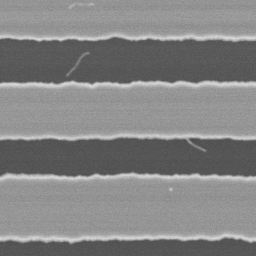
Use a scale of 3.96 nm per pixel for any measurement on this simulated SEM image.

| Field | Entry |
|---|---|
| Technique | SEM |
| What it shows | lines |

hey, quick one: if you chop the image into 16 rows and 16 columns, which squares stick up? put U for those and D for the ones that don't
UUUUUUUUUUUUUUUU
UUUUUUUUUUUUUUUU
DDUUDUDDDDDDDDUD
DDDDDDDDDDDDDDDD
DDDDDDDDDDDDDDDD
UUUUUUUUUUUUUUUU
UUUUUUUUUUUUUUUU
UUUUUUUUUUUUUUUU
UUUUUUUUUUUUUUUU
DDDDDDDDDDDDDDDD
DDDDDDDDDDDDDDDD
UUUUUUUUUUUUUUUU
UUUUUUUUUUUUUUUU
UUUUUUUUUUUUUUUU
UUUUUUUUUUUUUUUU
DDDDDDDDDDDDDDDD